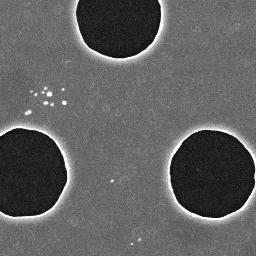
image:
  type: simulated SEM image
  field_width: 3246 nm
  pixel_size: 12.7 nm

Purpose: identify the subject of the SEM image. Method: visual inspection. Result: holes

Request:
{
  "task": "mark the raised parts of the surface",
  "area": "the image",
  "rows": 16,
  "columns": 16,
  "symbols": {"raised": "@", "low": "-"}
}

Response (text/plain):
@@@@@-----@@@@@@
@@@@@-----@@@@@@
@@@@@-----@@@@@@
@@@@@@@-@@@@@@@@
@@@@@@@@@@@@@@@@
@@@@@@@@@@@@@@@@
@@@@@@@@@@@@@@@@
@@@@@@@@@@@@@@@@
---@@@@@@@@@---@
----@@@@@@@-----
----@@@@@@@-----
----@@@@@@@-----
----@@@@@@@----@
@-@@@@@@@@@@--@@
@@@@@@@@@@@@@@@@
@@@@@@@@@@@@@@@@